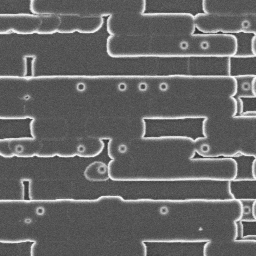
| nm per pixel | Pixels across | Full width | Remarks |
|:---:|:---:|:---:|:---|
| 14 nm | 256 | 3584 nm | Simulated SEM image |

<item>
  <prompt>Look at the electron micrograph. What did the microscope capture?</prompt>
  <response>wiring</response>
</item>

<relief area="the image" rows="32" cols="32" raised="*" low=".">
....**************.......*******
....**************.......*******
********************************
************.*******************
..............***************...
.............*****************..
..............***************...
................................
................................
.....................**.........
******************************..
*****************************...
*****************************...
******************************..
******************************..
....**************.......*******
....**************.......*******
********************************
*************.******************
*********.**..**********.*****.*
..............****************..
..............****************..
................................
................................
................................
******************************..
******************************..
******************************..
******************************..
******************************..
....**************........******
....**************........******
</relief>